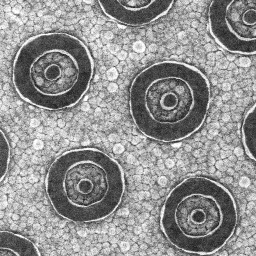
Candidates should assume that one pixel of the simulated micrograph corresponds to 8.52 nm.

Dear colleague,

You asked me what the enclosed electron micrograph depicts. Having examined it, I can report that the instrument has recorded ring-shaped raised bodies with a dot in the middle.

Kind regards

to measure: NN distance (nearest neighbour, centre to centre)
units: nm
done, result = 1010